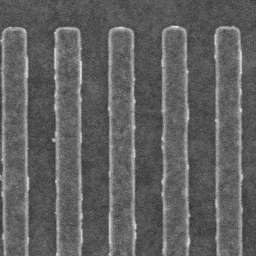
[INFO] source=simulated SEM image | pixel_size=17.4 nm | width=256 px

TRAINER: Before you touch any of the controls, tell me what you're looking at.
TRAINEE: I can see wiring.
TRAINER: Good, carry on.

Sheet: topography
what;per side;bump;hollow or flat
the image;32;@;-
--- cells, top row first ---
--------------------------------
--------------------------------
--------------------------------
----------------------------@---
@@@----@@@----@@@---@@@----@@@--
@@@----@@@----@@@---@@@----@@@--
@@@----@@@----@@@---@@@----@@@--
@@@----@@@----@@@---@@@----@@@--
@@@----@@@----@@@---@@@----@@@--
@@@----@@@----@@@---@@@----@@@--
@@@----@@@----@@@---@@@----@@@--
@@@----@@@----@@@---@@@----@@@--
@@@----@@@----@@@---@@@----@@@--
@@@----@@@----@@@---@@@----@@@--
@@@----@@@----@@@---@@@----@@@--
@@@----@@@----@@@---@@@----@@@--
@@@----@@@----@@@---@@@----@@@--
@@@----@@@----@@@---@@@----@@@--
@@@----@@@----@@@---@@@----@@@--
@@@----@@@----@@@---@@@----@@@--
@@@----@@@----@@@----@@----@@@--
@@@----@@@----@@@---@@@----@@@--
@@@----@@@----@@@---@@@----@@@--
@@@----@@@----@@@---@@@----@@@--
@@@----@@@----@@@---@@@----@@@--
@@@----@@@----@@@---@@@----@@@--
@@@----@@@----@@@---@@@----@@@--
@@@----@@@----@@@---@@@----@@@--
@@@----@@@----@@@---@@@----@@@--
-@@----@@@----@@@---@@@----@@@--
-@@----@@@----@@@---@@@----@@@--
-@@----@@@----@@@----@@----@@@--